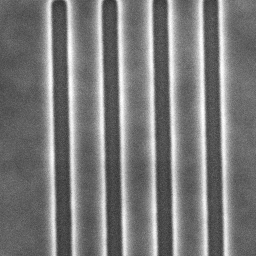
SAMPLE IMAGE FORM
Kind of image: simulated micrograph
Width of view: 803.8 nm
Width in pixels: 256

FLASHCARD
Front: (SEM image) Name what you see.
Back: groups of lines, slits or small figures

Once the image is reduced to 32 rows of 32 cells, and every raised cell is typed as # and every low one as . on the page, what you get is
######..#####..####..####...####
######...####..####..####...####
######...####..####..####...####
######...####..####..####...####
######...####..####..####...####
######...####..####..####...####
######...####..####..####...####
######...####..####..####...####
######...####..####..####...####
######...####..####..####...####
######...####..####..####...####
######...####..####..####...####
######...####..####..####...####
#######..####..####..####...####
#######..####..####..####...####
#######..####..####..####...####
#######..####..####...###...####
#######..####..####...###...####
#######..####..####...####..####
#######..####..####...####..####
#######..####..####...####..####
#######..####..####...####..####
#######..####..####...####..####
#######..####..####...####..####
#######..####..####...####..####
#######..####..####...####..####
#######..####..####...####..####
#######..####..####...####..####
#######..####..####...####..####
#######..####..####...####..####
#######..####...###...####..####
#######..####...###...####..####